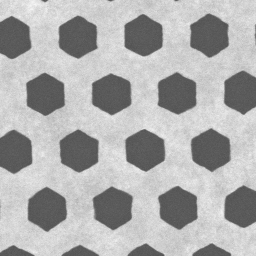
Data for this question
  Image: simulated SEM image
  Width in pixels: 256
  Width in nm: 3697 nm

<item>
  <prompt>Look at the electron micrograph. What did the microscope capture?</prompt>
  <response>a regular array of holes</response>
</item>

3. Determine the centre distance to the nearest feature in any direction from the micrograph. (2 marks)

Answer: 946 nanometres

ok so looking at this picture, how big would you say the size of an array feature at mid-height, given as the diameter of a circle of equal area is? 576 nm